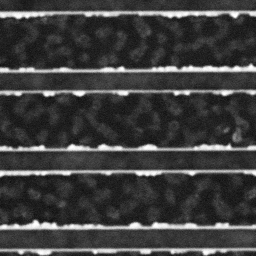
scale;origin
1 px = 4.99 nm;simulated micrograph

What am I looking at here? one or a few lines or trenches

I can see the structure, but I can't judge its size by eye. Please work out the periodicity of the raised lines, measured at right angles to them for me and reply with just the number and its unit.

394 nm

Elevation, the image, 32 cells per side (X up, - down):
--------------------------------
----------------------------XXXX
XXXXXXXXXXXXXXXXXXXXXXXXXXXXXXXX
XXXXXXXXXXXXXXXXXXXXXXXXXXXXXXXX
XXXXXXXXXXXXXXXXXXXXXXXXXXXXXXXX
XXXXXXXXXXXXXXXXXXXXXXXXXXXXXXXX
XXXXXXXXXXXXXXXXXXXXXXXXXXXXXXXX
XXXXXXXXXXXXXXXXXXXXXXXXXXXXXXXX
XXXXXXXXXXXXXXXXXXXXXXXXXXXXXXXX
--------------------------------
--------------------------------
XXXXXXXXXXXXXXXXXXXXXXXXXXXXXXXX
XXXXXXXXXXXXXXXXXXXXXXXXXXXXXXXX
XXXXXXXXXXXXXXXXXXXXXXXXXXXXXXXX
XXXXXXXXXXXXXXXXXXXXXXXXXXXXXXXX
XXXXXXXXXXXXXXXXXXXXXXXXXXXXXXXX
XXXXXXXXXXXXXXXXXXXXXXXXXXXXXXXX
XXXXXXXXXXXXXXXXXXXXXXXXXXXXXXXX
XXXXXXXXXXXXXXXXXXXXXXXXXXXXXXXX
--------------------------------
--------------------------------
--------XXXXXXXXXXXXXXXXXXXXXXXX
XXXXXXXXXXXXXXXXXXXXXXXXXXXXXXXX
XXXXXXXXXXXXXXXXXXXXXXXXXXXXXXXX
XXXXXXXXXXXXXXXXXXXXXXXXXXXXXXXX
XXXXXXXXXXXXXXXXXXXXXXXXXXXXXXXX
XXXXXXXXXXXXXXXXXXXXXXXXXXXXXXXX
XXXXXXXXXXXXXXXXXXXXXXXXXXXXXXXX
---------XX---------------------
--------------------------------
--------------------------------
XXXXXXXXXXXXXXXXXXXXXXXXXXXXXXXX